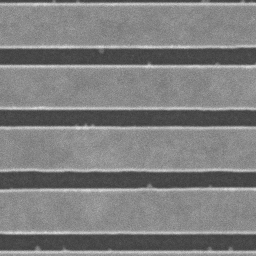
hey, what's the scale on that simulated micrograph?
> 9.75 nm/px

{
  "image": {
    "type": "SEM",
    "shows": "lines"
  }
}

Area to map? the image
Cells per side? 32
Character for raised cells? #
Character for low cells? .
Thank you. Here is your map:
################################
################################
################################
################################
################################
################################
................................
................................
################################
################################
################################
################################
################################
################################
................................
................................
################################
################################
################################
################################
################################
................................
................................
................................
################################
################################
################################
################################
################################
................................
................................
################################